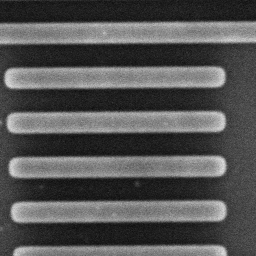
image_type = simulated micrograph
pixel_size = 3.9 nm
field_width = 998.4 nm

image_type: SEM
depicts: groups of lines, slits or small figures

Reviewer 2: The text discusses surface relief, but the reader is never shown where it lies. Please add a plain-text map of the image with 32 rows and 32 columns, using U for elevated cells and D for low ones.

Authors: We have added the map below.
DDDDDDDDDDDDDDDDDDDDDDDDDDDDDDDD
DDDDDDDDDDDDDDDDDDDDDDDDDDDDDDDD
DDDDDDDDDDDDDDDDDDDDDDDDDDDDDDDD
UUUUUUUUUUUUUUUUUUUUUUUUUUUUUUUU
UUUUUUUUUUUUUUUUUUUUUUUUUUUUUUUU
DDDDDDDDDDDDDDDDDDDDDDDDDDDDDDDD
DDDDDDDDDDDDDDDDDDDDDDDDDDDDDDDD
DDDDDDDDDDDDDDDDDDDDDDDDDDDDDDDD
DDDDDDDDDDDDDDDDDDDDDDDUUUUDDDDD
DUUUUUUUUUUUUUUUUUUUUUUUUUUUDDDD
DUUUUUUUUUUUUUUUUUUUUUUUUUUUDDDD
DDDDDDDDDDDDDDDDDDDDDDDDDDDDDDDD
DDDDDDDDDDDDDDDDDDDDDDDDDDDDDDDD
DDDDDDDDDDDDDDDDDDDDDDDDDDDDDDDD
DUUUUUUUUUUUUUUUUUUUUUUUUUUUDDDD
DUUUUUUUUUUUUUUUUUUUUUUUUUUUDDDD
DDUUUDDDDDDDDDDDDDDDDDDDDDDDDDDD
DDDDDDDDDDDDDDDDDDDDDDDDDDDDDDDD
DDDDDDDDDDDDDDDDDDDDDDDDDDDDDDDD
DDDDDDDDDDDDDDDDDDDDDDDDDDDDDDDD
DUUUUUUUUUUUUUUUUUUUUUUUUUUUDDDD
DUUUUUUUUUUUUUUUUUUUUUUUUUUUDDDD
DDDDDDDDDDDDDDDDDDDDDDDDDDDDDDDD
DDDDDDDDDDDDDDDDDDDDDDDDDDDDDDDD
DDDDDDDDDDDDDDDDDDDDDDDDDDDDDDDD
DDUUUUUUUUUUUUUUUUUUUUUUUUUUDDDD
DDUUUUUUUUUUUUUUUUUUUUUUUUUUDDDD
DDUUUUUUUUUUUUUUUUUUUUUUUUUUDDDD
DDDDDDDDDDDDDDDDDDDDDDDDDDDDDDDD
DDDDDDDDDDDDDDDDDDDDDDDDDDDDDDDD
DDDDDDDDDDDDDDDDDDDDDDDDDDDDDDDD
DDUUUUUUUUUUUUUUUUUUUUUUUUUUDDDD